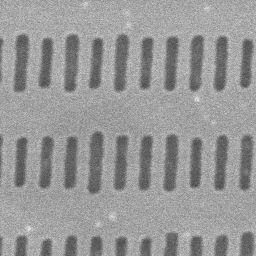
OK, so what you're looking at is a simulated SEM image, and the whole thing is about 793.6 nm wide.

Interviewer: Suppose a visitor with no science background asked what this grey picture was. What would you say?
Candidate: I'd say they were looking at a regular array of holes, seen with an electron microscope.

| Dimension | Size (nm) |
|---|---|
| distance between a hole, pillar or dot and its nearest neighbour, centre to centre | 77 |